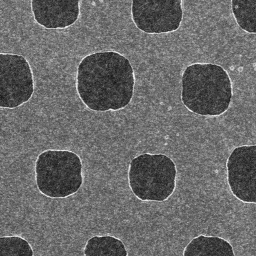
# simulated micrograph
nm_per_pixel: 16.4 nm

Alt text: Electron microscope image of raised bodies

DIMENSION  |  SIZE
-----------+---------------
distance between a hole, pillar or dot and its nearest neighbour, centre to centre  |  1600 nanometers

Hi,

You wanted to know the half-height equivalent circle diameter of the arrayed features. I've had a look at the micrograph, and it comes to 854 nm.